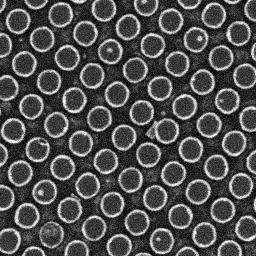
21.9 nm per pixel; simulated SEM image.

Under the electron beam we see a regular array of raised bodies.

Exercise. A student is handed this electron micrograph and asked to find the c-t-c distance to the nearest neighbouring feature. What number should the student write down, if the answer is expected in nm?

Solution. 660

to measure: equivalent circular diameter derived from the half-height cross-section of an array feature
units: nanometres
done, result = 514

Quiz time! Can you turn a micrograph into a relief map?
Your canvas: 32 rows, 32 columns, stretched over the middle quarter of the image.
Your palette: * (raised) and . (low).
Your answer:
***...***......*****......*****.
.....*****.....******.....*****.
....******.....*****.......***..
....******......****...**.......
.....****.............****......
......***..****......******.....
.***.......*****.....******.....
*****.....******.....*****......
*****......*****.......**...****
*****......****...***.......****
*****.......**...*****.....*****
.***...****......*****.....*****
......******.....*****......****
......******.....*****.......**.
*.....******......***...****....
*.....*****...**.......*****....
*.......*....****......******...
...***......******.....*****....
..*****.....******.....*****...*
..*****.....******......***...**
..*****......****..****......***
..*****...*........*****.....***
...***..*****.....******.....***
*.......*****.....******......**
**......*****......****.........
**......*****.......*....*****..
**.......***...***.......*****..
**...**.......*****......*****..
*...****......*****......*****..
...*****......*****......****...
...******.....*****............*
...*****.......***...****......*